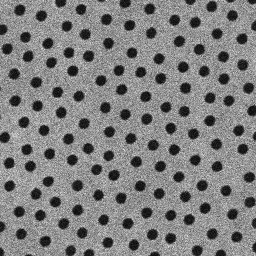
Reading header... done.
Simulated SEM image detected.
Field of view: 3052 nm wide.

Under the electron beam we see a regular array of holes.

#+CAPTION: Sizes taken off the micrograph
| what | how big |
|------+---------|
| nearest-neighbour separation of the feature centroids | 252 nanometres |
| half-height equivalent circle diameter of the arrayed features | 134 nm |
